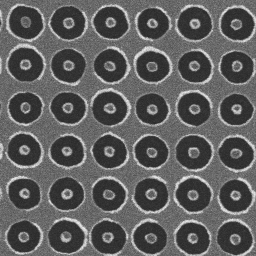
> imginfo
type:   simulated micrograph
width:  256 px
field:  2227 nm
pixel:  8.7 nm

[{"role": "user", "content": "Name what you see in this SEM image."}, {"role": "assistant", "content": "a regular array of ring-shaped grooves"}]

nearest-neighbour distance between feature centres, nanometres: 366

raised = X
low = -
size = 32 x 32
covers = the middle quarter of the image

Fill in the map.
XXX--XX---XXX---XX---XX---XX---X
XX---XXX---XX---XX---XX---XXX---
-----XXX-------XXX--------XXX---
----XXXXX------XXXX------XXXXX--
---XXXXXXXX--XXXXXXXX--XXXXXXXXX
XXXXXXXXXXXXXXXXXXXXXXXXXXXXXXXX
XXXXXXXXXXXXXXXXXXXXXXXXXXXXXXXX
---XXXXXX----XXXXXXXX--XXXXXXXX-
----XXXX-------XXXX------XXXX---
-----XX--------XXX-------XXXX---
XX---XX---XXX---XX---XX---XX----
XX---XX---XXX---XX---XX---XX---X
-----XX--------XXX----X---XXX---
-----XXX-------XXXX------XXXX---
----XXXXX-----XXXXXX-----XXXXX--
XXXXXXXXXXXXXXXXXXXXXXXXXXXXXXXX
XXXXXXXXXXXXXXXXXXXXXXXXXXXXXXXX
XXXXXXXXXXXXXXXXXXXXXXXXXXXXXXXX
---XXXXXX-----XXXXXX----XXXXXX--
----XXXX-------XXX-------XXXX---
-----XX--------XXX--------XX----
XX---XX---XX----XX---XX---XX---X
XX---XX---XX----XX---XX---XX---X
-----XXX--------XX--------XX----
----XXXX-------XXXX------XXXX---
--XXXXXXX-----XXXXXX----XXXXXX--
XXXXXXXXXXXXXXXXXXXXXXXXXXXXXXXX
XXXXXXXXXXXXXXXXXXXXXXXXXXXXXXXX
--XXXXXXXXXXXXXXXXXXX-XXXXXXXXXX
----XXXX-----XXXXXX------XXXX---
----XXXX-------XXX-------XXXX---
X----XX--------XXX---XX---XX----